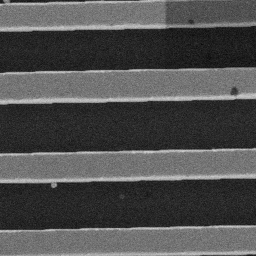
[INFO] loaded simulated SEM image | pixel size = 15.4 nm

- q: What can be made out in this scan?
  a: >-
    lines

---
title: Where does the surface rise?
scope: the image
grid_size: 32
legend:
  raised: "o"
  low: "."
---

.ooooooooooooooooooooooooooooooo
oooooooooooooooooooooooooooooooo
oooooooooooooooooooooooooooooooo
ooooooooooooooooooo.............
................................
................................
................................
................................
................................
oooooooooooooooooooooooooooooooo
oooooooooooooooooooooooooooooooo
oooooooooooooooooooooooooooooooo
oooooooooooooooooooooo..........
................................
................................
................................
................................
................................
................................
oooooooooooooooooooooooooooooooo
oooooooooooooooooooooooooooooooo
oooooooooooooooooooooooooooooooo
ooooooooooooooo.................
................................
................................
................................
................................
................................
................oooooooooooooooo
oooooooooooooooooooooooooooooooo
oooooooooooooooooooooooooooooooo
oooooooooooooooooooooooooooooooo